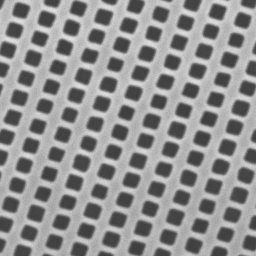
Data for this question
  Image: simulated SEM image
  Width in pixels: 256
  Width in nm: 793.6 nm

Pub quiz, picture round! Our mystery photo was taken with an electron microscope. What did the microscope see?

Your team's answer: a regular array of holes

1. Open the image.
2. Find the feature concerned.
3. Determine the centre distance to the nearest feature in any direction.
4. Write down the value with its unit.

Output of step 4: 64.2 nm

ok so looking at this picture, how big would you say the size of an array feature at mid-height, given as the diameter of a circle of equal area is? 52.4 nanometres